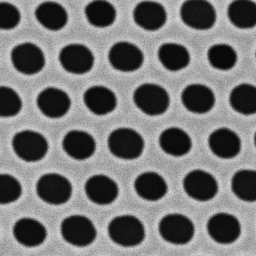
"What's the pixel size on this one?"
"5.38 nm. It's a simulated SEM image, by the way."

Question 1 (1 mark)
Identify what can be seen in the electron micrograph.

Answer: a regular array of holes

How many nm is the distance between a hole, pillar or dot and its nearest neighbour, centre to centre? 256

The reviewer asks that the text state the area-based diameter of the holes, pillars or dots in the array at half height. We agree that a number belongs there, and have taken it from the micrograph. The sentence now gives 0.177 µm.